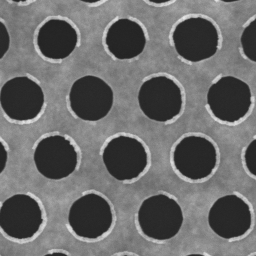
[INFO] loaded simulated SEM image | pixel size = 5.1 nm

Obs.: a regular array of holes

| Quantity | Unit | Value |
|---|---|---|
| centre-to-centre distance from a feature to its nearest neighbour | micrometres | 0.347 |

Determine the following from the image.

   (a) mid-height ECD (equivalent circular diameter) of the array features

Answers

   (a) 222 nm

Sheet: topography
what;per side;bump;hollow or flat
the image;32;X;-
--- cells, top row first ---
XXXXXXXXXXXXXXXXXXXXXXXXXXXXXXXX
XXXXXXXXXXXXXXXXXXXXXXXXXXXXXXXX
XXXXXX-XXXXXXXX-XXXXXXX---XXXXXX
-XXXX----XXXXX----XXXX-----XXXX-
-XXXX-----XXX-----XXXX-----XXX--
-XXXX----XXXX-----XXXX-----XXX--
-XXXX----XXXXX----XXXX-----XXXX-
XXXXXXXXXXXXXXXXXXXXXXX--XXXXXX-
XXXXXXXXXXXXXXXXXXXXXXXXXXXXXXXX
XXXXXXXXXXXXXXXXXXXXXXXXXXXXXXXX
X----XXXX----XXXXX----XXXXX----X
-----XXXX-----XXX------XXX-----X
-----XXXX-----XXX------XXX-----X
-----XXXX-----XXXX-----XXX-----X
X---XXXXXX---XXXXX----XXXXX---XX
XXXXXXXXXXXXXXXXXXXXXXXXXXXXXXXX
XXXXXXXXXXXXXXXXXXXXXXXXXXXXXXXX
XXXXX---XXXXXX---XXXXXX---XXXXXX
-XXXX----XXXX-----XXXX-----XXXX-
-XXX------XXX-----XXXX-----XXXX-
-XXX------XXX-----XXXX-----XXXX-
XXXXX----XXXXX----XXXXX---XXXXX-
XXXXXXXXXXXXXXXXXXXXXXXXXXXXXXXX
XXXXXXXXXXXXXXXXXXXXXXXXXXXXXXXX
XX--XXXXXX--XXXXXXX--XXXXXXX--XX
-----XXXX-----XXXX----XXXXX----X
-----XXXX-----XXX------XXX-----X
-----XXXX-----XXX------XXX-----X
-----XXXX-----XXXX----XXXX-----X
X---XXXXXX--XXXXXXX---XXXXX---XX
XXXXXXXXXXXXXXXXXXXXXXXXXXXXXXXX
XXXXXXXXXXXXXXXXXXXXXXXXXXXXXXXX